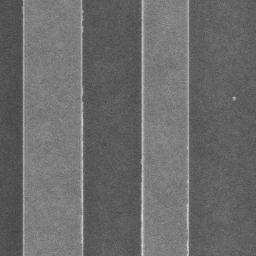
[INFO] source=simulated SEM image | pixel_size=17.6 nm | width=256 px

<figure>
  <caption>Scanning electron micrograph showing lines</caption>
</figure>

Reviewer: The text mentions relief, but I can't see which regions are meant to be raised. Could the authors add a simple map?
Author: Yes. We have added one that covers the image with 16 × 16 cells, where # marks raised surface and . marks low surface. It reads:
.####....###....
.####....###....
.####....###....
.####....###....
.####....###....
.####....###....
.####....###....
.####....###....
.####....###....
.####....###....
.####....###....
.####....###....
.####....###....
.####....###....
.####....###....
.####....###....